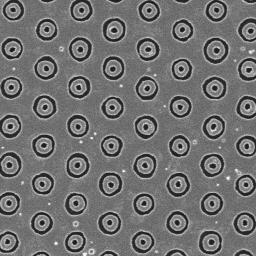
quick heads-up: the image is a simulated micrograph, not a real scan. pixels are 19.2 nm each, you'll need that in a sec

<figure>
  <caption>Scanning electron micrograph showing a regular array of ring-shaped grooves with a dot in the middle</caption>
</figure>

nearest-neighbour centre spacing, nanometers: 734